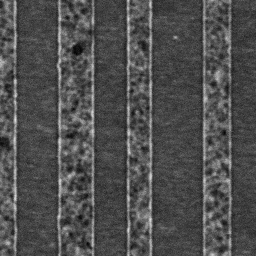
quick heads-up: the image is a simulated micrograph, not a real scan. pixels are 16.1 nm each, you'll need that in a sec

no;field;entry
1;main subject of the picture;one or a few lines or trenches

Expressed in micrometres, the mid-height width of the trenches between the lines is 0.713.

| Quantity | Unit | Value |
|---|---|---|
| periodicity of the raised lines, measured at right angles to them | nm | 1130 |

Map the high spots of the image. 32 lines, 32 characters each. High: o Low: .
oo.....ooooo....ooo.......ooo...
oo.....ooooo....ooo.......ooo...
oo.....ooooo....ooo.......ooo...
oo......oooo....ooo.......ooo...
oo.....ooooo....ooo.......ooo...
oo.....ooooo....ooo.......ooo...
oo.....ooooo....ooo.......ooo...
oo.....ooooo....ooo.......ooo...
oo.....ooooo....ooo.......ooo...
oo.....ooooo....ooo.......ooo...
oo.....ooooo....ooo.......ooo...
oo.....ooooo....ooo.......ooo...
oo.....ooooo....ooo.......ooo...
oo......oooo....ooo.......ooo...
oo.....ooooo....ooo.......ooo...
oo.....ooooo....ooo.......ooo...
oo......oooo....ooo.......ooo...
oo......oooo....ooo.......ooo...
oo.....ooooo....ooo.......ooo...
oo.....ooooo....ooo.......ooo...
oo.....ooooo....ooo.......ooo...
oo.....ooooo....ooo.......ooo...
oo.....ooooo....ooo.......ooo...
oo......oooo....ooo.......ooo...
oo.....ooooo....ooo.......ooo...
oo.....ooooo....ooo.......ooo...
oo.....ooooo....ooo.......ooo...
oo.....ooooo....ooo.......ooo...
oo.....ooooo....ooo.......ooo...
oo.....ooooo....ooo.......ooo...
oo.....ooooo....ooo.......ooo...
oo.....ooooo....ooo.......ooo...